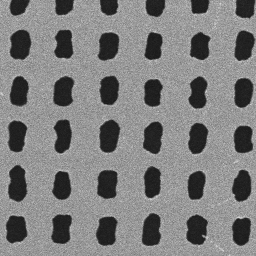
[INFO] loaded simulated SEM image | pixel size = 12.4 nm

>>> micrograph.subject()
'a regular array of holes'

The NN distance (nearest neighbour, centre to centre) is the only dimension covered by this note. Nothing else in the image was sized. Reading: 550 nanometers